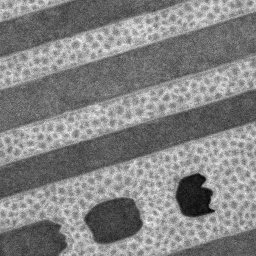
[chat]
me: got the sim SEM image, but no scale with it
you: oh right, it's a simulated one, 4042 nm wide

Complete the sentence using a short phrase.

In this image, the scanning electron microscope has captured one or a few lines or trenches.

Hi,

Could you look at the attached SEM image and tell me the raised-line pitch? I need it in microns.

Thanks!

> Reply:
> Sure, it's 1.1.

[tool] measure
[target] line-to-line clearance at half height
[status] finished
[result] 570 nanometers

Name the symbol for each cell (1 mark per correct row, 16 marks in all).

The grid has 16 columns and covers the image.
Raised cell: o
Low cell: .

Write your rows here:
ooo.......oooooo
.......oooooo...
....oooooo......
.oooooo.........
ooo..........ooo
.........ooooooo
......ooooooo...
...oooooo.......
oooooo.......ooo
ooo.......oooooo
.......ooooooooo
...oooooooo..ooo
ooooooo.ooo..ooo
ooooo....ooo.ooo
....oo...oooooo.
....oooooooo....